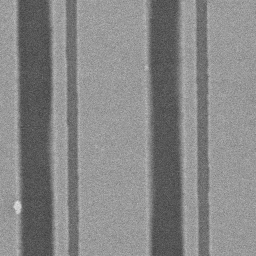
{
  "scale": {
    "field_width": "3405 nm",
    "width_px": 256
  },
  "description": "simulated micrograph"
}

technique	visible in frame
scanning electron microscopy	lines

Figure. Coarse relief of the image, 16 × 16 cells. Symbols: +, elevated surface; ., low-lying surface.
+..++++++..+++++
+..++++++..+++++
+..++++++..+++++
+..++++++..+++++
+..++++++..+++++
+..++++++..+++++
+..++++++..+++++
+..++++++..+++++
+..++++++..+++++
+..++++++..+++++
+..++++++...++++
+..++++++...++++
+..++++++...++++
+..++++++...++++
+..++++++...++++
+...+++++...++++